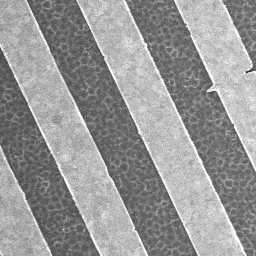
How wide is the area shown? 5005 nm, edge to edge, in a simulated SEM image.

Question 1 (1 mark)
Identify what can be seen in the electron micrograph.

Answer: one or a few lines or trenches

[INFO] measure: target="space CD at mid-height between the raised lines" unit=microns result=0.884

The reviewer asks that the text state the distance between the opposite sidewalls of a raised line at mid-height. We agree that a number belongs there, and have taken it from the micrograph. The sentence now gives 0.834 microns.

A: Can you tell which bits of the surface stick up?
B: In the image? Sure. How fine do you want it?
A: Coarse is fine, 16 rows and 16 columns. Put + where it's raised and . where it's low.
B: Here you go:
++...+++...+++..
++....++....+++.
+++...+++...+++.
+++...+++....+++
.+++...+++...+++
.+++...+++...+++
..+++...+++...++
..+++...+++...++
...+++...+++...+
...+++...+++...+
+...+++...+++...
+...+++...+++...
++...+++...+++..
++...+++...+++..
+++...+++...+++.
+++...+++...+++.